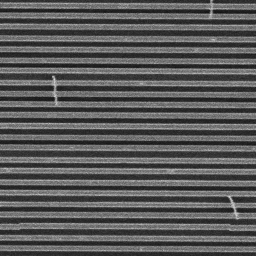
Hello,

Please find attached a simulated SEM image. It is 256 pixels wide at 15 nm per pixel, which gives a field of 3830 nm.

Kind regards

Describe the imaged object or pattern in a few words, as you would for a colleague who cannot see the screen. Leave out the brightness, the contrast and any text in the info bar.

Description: parallel lines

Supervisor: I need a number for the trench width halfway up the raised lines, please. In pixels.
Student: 5.75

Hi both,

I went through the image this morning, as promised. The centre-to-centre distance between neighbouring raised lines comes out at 165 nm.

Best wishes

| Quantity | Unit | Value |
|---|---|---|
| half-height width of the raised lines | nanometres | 86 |